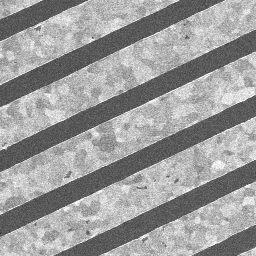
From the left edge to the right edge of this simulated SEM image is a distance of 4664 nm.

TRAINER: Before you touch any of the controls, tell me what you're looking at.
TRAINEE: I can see parallel lines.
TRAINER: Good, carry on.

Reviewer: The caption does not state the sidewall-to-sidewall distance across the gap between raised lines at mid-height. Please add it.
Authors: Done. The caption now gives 0.364 µm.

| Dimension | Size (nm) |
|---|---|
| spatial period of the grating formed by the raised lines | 1060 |